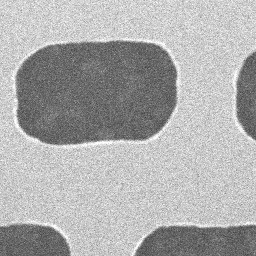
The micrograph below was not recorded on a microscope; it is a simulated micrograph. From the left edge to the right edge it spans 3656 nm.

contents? holes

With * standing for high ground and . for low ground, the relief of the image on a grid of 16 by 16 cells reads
****************
****************
*******.********
**.........*****
*..........****.
*..........****.
*..........****.
*..........****.
**........******
****************
****************
****************
****************
****************
....*****.......
....*****.......